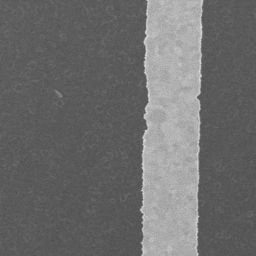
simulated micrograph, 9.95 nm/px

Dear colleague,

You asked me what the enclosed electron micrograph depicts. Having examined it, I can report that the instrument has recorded one or a few lines or trenches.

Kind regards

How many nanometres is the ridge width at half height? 542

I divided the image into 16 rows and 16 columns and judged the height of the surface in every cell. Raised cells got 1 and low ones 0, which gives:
0000000001111000
0000000001111000
0000000001111000
0000000001111000
0000000001111000
0000000001110000
0000000001110000
0000000001110000
0000000001110000
0000000001110000
0000000001110000
0000000001110000
0000000001110000
0000000001110000
0000000001110000
0000000001110000